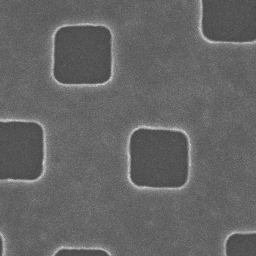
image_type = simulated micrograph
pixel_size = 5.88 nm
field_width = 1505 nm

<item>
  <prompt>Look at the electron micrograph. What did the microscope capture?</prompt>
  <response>holes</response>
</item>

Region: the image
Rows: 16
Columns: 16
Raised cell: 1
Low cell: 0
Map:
1111111111111000
1111111111111000
1110000111111000
1110000111111111
1110000111111111
1111111111111111
1111111111111111
1111111111111111
0001111100001111
0001111100001111
0001111100001111
1111111110011111
1111111111111111
1111111111111111
1111111111111111
1111111111111100